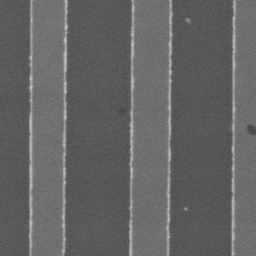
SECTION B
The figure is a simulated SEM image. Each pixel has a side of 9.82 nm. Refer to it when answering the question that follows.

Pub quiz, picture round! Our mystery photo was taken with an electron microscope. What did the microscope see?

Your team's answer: lines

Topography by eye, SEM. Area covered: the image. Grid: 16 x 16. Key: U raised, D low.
DDUUDDDDUUUDDDDU
DDUUDDDDUUUDDDDU
DDUUDDDDUUUDDDDU
DDUUDDDDUUUDDDDU
DDUUDDDDUUUDDDDU
DDUUDDDDUUUDDDDU
DDUUDDDDUUUDDDDU
DDUUDDDDUUUDDDDU
DDUUDDDDUUUDDDDU
DDUUDDDDUUUDDDDU
DDUUDDDDUUUDDDDU
DDUUDDDDUUUDDDDU
DDUUDDDDUUUDDDDU
DDUUDDDDUUUDDDDU
DDUUDDDDUUUDDDDU
DDUUDDDDUUUDDDDU